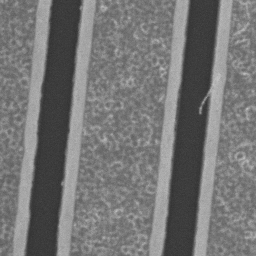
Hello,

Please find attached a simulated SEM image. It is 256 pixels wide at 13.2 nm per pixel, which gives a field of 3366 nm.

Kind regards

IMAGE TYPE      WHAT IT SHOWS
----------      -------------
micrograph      one or a few lines or trenches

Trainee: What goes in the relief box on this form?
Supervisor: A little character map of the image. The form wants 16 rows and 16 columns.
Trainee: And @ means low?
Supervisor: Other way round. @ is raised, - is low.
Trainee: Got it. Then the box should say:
@@@---@@@@@---@@
@@@--@@@@@@---@@
@@@--@@@@@@---@@
@@---@@@@@@---@@
@@---@@@@@@---@@
@@---@@@@@@---@@
@@---@@@@@@--@@@
@@---@@@@@@--@@@
@@---@@@@@---@@@
@@---@@@@@---@@@
@@--@@@@@@---@@@
@@--@@@@@@---@@@
@@--@@@@@@---@@@
@---@@@@@@---@@@
@---@@@@@@---@@@
@---@@@@@@---@@@